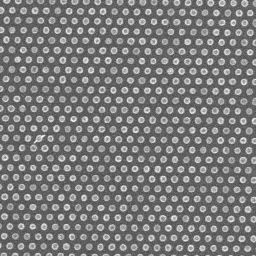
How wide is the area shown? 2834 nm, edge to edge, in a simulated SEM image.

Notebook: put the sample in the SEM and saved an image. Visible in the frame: a regular array of raised bodies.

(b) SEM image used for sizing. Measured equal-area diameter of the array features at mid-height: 68.4 nanometres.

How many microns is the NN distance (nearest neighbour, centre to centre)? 0.123